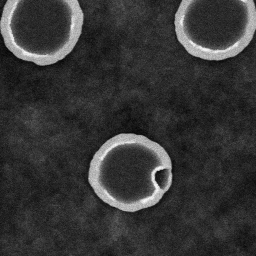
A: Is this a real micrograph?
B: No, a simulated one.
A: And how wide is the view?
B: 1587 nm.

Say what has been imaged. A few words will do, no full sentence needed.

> raised bodies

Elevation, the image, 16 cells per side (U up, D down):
UUUUUDDDDDDUUUUU
UUUUUDDDDDDUUUUU
UUUUUDDDDDDDUUUD
DUUUDDDDDDDDDUDD
DDDDDDDDDDDDDDDD
DDDDDDDDDDDDDDDD
DDDDDDDDDDDDDDDD
DDDDDDDDDDDDDDDD
DDDDDDDDDDDDDDDD
DDDDDDUUUUDDDDDD
DDDDDDUUUUDDDDDD
DDDDDDUUUUDDDDDD
DDDDDDDUUUDDDDDD
DDDDDDDDDDDDDDDD
DDDDDDDDDDDDDDDD
DDDDDDDDDDDDDDDD